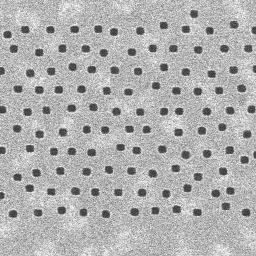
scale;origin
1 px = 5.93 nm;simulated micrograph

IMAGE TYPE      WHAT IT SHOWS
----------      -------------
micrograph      a regular array of holes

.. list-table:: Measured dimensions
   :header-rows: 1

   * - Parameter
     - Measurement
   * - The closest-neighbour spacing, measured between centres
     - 0.117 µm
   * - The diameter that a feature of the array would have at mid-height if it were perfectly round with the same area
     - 0.0519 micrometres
